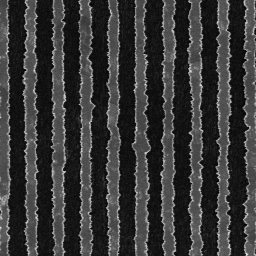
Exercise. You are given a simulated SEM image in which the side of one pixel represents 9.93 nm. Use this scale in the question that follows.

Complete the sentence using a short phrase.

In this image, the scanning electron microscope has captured parallel lines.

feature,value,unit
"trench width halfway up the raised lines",17.3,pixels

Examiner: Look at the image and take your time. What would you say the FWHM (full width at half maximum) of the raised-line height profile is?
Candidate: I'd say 103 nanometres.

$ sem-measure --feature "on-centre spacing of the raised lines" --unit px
27.5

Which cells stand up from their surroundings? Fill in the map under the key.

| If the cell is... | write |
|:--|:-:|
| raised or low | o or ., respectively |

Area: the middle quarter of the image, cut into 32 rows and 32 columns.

....ooo....oo.....ooo....oo....o
....ooo....oo.....oo.....ooo...o
....ooo.....o.....oo.....oo....o
....ooo....oo.....oo.....oo....o
....ooo....oo.....ooo....oo....o
....ooo....ooo....oo.....oo.....
....ooo....ooo....oo.....oo.....
....ooo....ooo....oo.....oo.....
....ooo....ooo....ooo....oo.....
....ooo....ooo....ooo....oo.....
....oooo...ooo....ooo....oo.....
....ooo....ooo....oo.....oo.....
....ooo....ooo....oo.....oo.....
....ooo....ooo....ooo....oo.....
....ooo....oo.....ooo....oo.....
.....oo....oo.....ooo....oo.....
....ooo....ooo....ooo....oo.....
....ooo.....oo....oo.....oo.....
....ooo.....oo....ooo....oo.....
....ooo....ooo....ooo....oo.....
....ooo....ooo...ooooo...oo.....
....ooo....ooo....ooo....oo.....
....oo.....ooo....ooo....oo.....
....ooo....ooo....oo.....oo.....
....ooo....ooo....ooo....oo.....
.....oo....ooo....ooo....ooo....
....ooo....ooo....ooo....ooo....
....ooo....ooo....ooo...oooo....
....ooo....ooo....ooo...ooo....o
....ooo....ooo....ooo...ooo.....
.....oo....ooo....ooo....oo.....
....ooo....ooo....ooo....oo.....